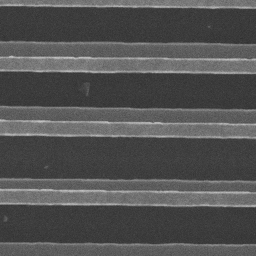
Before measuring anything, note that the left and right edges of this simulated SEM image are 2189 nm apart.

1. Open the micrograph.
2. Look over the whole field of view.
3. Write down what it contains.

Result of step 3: lines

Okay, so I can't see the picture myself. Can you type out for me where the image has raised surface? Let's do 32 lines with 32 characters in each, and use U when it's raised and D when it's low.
UUUUUUUUUUUUUUUUUUUUUUUUUUUUUUUU
DDDDDDDDDDDDDDDDDDDDDDDDDDDDDDDD
DDDDDDDDDDDDDDDDDDDDDDDDDDDDDDDD
DDDDDDDDDDDDDDDDDDDDDDDDDDDDDDDD
DDDDDDDDDDDDDDDDDDDDDDDDDDDDDDDD
UUUUUUUUUUUUUUUUUUUUUUUUUUUUDDDD
UUUUUUUUUUUUUUUUUUUUUUUUUUUUUUUU
UUUUUUUUUUUUUUUUUUUUUUUUUUUUUUUU
UUUUUUUUUUUUUUUUUUUUUUUUUUUUUUUU
DDDDDDDDDDDDDDDDDDDDDDDDDDDDDDDD
DDDDDDDDDDDDDDDDDDDDDDDDDDDDDDDD
DDDDDDDDDDDDDDDDDDDDDDDDDDDDDDDD
DDDDDDDDDDDDDDDDDDDDDDDDDDDDDDDD
UUUUUUUUUUDDDDDDDDDDDDDDDDDDDDDD
UUUUUUUUUUUUUUUUUUUUUUUUUUUUUUUU
UUUUUUUUUUUUUUUUUUUUUUUUUUUUUUUU
UUUUUUUUUUUUUUUUUUUUUUUUUUUUUUUU
DDDDDDDDDDDDDDDDDDDDDDDDDDDDDDDD
DDDDDDDDDDDDDDDDDDDDDDDDDDDDDDDD
DDDDDDDDDDDDDDDDDDDDDDDDDDDDDDDD
DDDDDDDDDDDDDDDDDDDDDDDDDDDDDDDD
DDDDDDDDDDDDDDDDDDDDDDDDDDDDDDDD
UUUUUUUUUUUUUDDDDDDDDDDDDDDDDDDD
UUUUUUUUUUUUUUUUUUUUUUUUUUUUUUUU
UUUUUUUUUUUUUUUUUUUUUUUUUUUUUUUU
DDDDDDUUUUUUUUUUUUUUUUUUUUUUUUUU
DDDDDDDDDDDDDDDDDDDDDDDDDDDDDDDD
DDDDDDDDDDDDDDDDDDDDDDDDDDDDDDDD
DDDDDDDDDDDDDDDDDDDDDDDDDDDDDDDD
DDDDDDDDDDDDDDDDDDDDDDDDDDDDDDDD
UUUUUUUUUUUUUUUDUUDDDUUUDDDDDDDD
UUUUUUUUUUUUUUUUUUUUUUUUUUUUUUUU